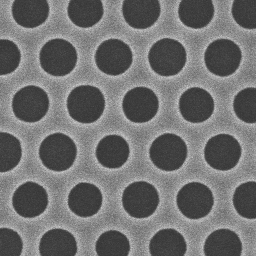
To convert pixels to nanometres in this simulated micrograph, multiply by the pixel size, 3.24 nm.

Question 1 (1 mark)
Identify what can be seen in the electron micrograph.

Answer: a regular array of holes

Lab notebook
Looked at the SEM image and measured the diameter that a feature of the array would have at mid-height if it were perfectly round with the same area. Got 120 nm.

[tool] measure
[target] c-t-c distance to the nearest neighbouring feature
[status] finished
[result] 176 nanometers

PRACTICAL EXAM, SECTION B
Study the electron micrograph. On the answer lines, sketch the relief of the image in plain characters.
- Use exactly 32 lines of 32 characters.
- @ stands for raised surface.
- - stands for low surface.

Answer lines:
@@----@@@----@@-----@@-----@@---
@-----@@@----@@-----@@-----@@---
@@----@@@---@@@@----@@@---@@@---
@@@@@@@@@@@@@@@@@-@@@@@@-@@@@@--
@@@@@@@@@@@@@@@@@@@@@@@@@@@@@@@@
--@@@@---@@@@---@@@----@@@---@@@
--@@@-----@@----@@@----@@@----@@
--@@@-----@@----@@@----@@@----@@
--@@@----@@@----@@@----@@@----@@
@@@@@@@@@@@@@@@@@@@@-@@@@@@-@@@@
@@@@@@@@@@@@@@@@@@@@@@@@@@@@@@@@
@@----@@@----@@@---@@@@---@@@@--
@@----@@-----@@-----@@-----@@---
@@----@@-----@@-----@@-----@@---
@@----@@@----@@@---@@@@---@@@@--
@@@@@@@@@@@@@@@@@@@@@@@@@@@@@@@@
-@@@@@@@@@@@@@@@@@@@@@@@@@@@@@@@
--@@@----@@@@---@@@----@@@----@@
---@@-----@@----@@@----@@@----@@
---@@-----@@----@@@----@@@----@@
--@@@----@@@@--@@@@----@@@----@@
-@@@@@@@@@@@@@@@@@@@@@@@@@@@@@@@
@@@@@@@@@@@@@@@@@@@@@@@@@@@@@@@@
@@---@@@@---@@@@---@@@@---@@@@--
@@----@@@----@@-----@@-----@@---
@@----@@-----@@-----@@-----@@---
@@---@@@@---@@@@---@@@@---@@@@--
@@@@@@@@@@@@@@@@@@@@@@@@@@@@@@@@
-@@@@@@@@@@@@@@@@@@@@@@@@@@@@@@@
--@@@----@@@@---@@@----@@@----@@
---@@-----@@----@@@----@@@----@@
---@@-----@@----@@@----@@-----@@